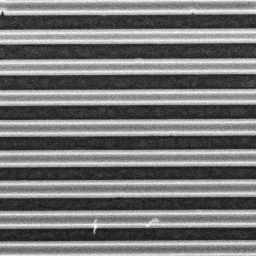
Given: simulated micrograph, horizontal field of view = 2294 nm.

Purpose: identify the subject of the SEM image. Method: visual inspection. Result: parallel lines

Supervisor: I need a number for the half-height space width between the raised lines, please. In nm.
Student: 154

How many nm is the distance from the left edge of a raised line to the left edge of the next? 273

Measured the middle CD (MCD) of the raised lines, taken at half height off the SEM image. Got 120 nm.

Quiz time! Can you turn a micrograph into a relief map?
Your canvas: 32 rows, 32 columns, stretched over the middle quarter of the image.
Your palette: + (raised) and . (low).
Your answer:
++++++++++++++++++++++++++++++++
++++++++++++++++++++++++++++++++
................................
................................
................................
................................
................................
++++++++++++++++++++++++++++++++
++++++++++++++++++++++++++++++++
++++++++++++++++++++++++++++++++
................................
................................
................................
................................
++++++++++++++++++++++++++++++++
++++++++++++++++++++++++++++++++
++++++++++++++++++++++++++++++++
+++++++++++++...................
................................
................................
................................
................................
++++++++++++++++++++++++++++++++
++++++++++++++++++++++++++++++++
++++++++++++++++++++++++++++++++
................................
................................
................................
................................
....++++.......+++++++++++++++++
++++++++++++++++++++++++++++++++
++++++++++++++++++++++++++++++++